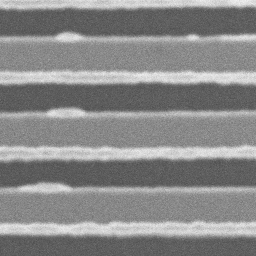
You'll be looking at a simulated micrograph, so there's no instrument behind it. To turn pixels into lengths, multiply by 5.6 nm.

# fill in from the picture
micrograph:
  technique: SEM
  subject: lines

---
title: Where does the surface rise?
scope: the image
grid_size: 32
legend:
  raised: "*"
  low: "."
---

********************************
................................
................................
................................
.......***..............*...****
********************************
********************************
********************************
********************************
********************************
................................
................................
................................
................................
********************************
********************************
********************************
********************************
********************************
********************************
................................
................................
................................
..*******.......................
********************************
********************************
********************************
********************************
********************************
................................
................................
................................